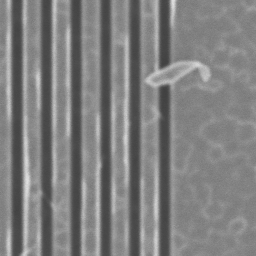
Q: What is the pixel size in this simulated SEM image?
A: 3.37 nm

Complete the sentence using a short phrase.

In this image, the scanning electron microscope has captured parallel lines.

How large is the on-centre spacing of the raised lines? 0.0994 micrometres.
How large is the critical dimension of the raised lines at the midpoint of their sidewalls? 62.7 nm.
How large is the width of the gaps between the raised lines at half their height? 11 px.